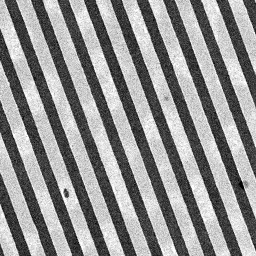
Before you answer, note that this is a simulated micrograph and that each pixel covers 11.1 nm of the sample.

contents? parallel lines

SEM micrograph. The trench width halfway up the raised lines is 127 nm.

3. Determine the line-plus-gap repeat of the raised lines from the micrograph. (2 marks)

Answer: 0.274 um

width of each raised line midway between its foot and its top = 0.147 micrometres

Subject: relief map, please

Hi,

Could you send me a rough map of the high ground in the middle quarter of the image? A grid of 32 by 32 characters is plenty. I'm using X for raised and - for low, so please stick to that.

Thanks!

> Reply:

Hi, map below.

-XXX---XXXX---XXXX---XXX---XXXX-
-XXXX---XXX---XXXX---XXX----XXX-
--XXX---XX-----XXX---XXXX---XXX-
--XXX----XXX---XXXX---XXX---XXXX
--XXXX---XXX---XXXX---XXXX---XXX
---XXX---XXXX---XXX----XXX---XXX
---XXXX---XXX---XXXX---XXX---XXX
---XXXX---XXX----XXX---XXXX---XX
X---XXX---XXXX---XXX----XXX---XX
X---XXXX---XXX---XXXX---XXX----X
X---XXXX---X-XX---XXX---XXXX---X
XX---XXX---XXXX---XXXX---XXX---X
XX---XXXX---XXX---XXXX---XXXX---
XX----XXX---XXXX---XXX---XXXX---
XXX---XXX----XXX---XXXX---XXX---
XXX---XXXX---XXX----XXX---XXXX--
XXXX---XXX---XXXX---XXX----XXX--
XXXX---XX-X---XXX---XXXX---XXX--
-XXX---XX-X---XXXX---XXX---XXXX-
-XXXX---X-X---XXXX---XXXX---XXX-
--XXX---XX-X---XXX---XXXX---XXX-
--XXX----XXX---XXXX---XXX---XXXX
--XXXX---XXX----XXX---XXXX---XXX
---XXX---XXXX---XXX---XXXX---XXX
---XXXX---XXX---XXXX---XXX---XXX
---XXXX---XXXX---XXX---XXXX---XX
X---XXX---XXXX---XXX----XXX---XX
X---XXXX---XXX---XXXX---XXXX---X
X----XXX---XXXX---XXX---XXXX---X
XX---XXX---XXXX---XXXX---XXX---X
-X---XXXX-----X---XXXX---XXXX---
------XXX-----XX---XXX---XXXX---